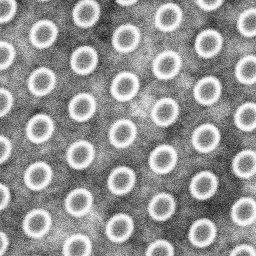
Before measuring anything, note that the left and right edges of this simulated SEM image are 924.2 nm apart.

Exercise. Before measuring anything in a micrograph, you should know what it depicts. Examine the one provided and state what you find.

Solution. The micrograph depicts a regular array of raised bodies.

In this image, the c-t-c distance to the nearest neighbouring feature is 170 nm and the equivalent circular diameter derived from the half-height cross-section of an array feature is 91.1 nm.